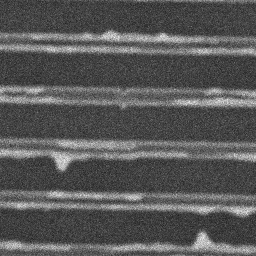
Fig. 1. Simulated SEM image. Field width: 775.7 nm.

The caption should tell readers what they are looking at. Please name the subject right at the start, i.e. parallel lines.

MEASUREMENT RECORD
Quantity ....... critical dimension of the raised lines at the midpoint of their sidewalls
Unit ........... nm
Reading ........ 47.4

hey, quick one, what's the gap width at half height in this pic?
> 112 nanometers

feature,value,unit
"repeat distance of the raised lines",160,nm